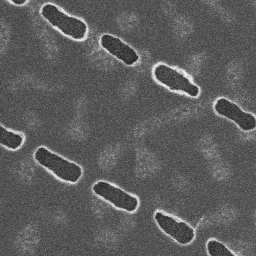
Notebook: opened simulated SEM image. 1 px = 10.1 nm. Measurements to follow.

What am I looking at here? holes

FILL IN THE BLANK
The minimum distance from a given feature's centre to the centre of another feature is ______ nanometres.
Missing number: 648